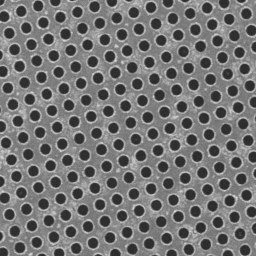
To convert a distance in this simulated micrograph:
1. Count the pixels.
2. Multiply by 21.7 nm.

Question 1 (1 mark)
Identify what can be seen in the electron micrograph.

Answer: a regular array of holes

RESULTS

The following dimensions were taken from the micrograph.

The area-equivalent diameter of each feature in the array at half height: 243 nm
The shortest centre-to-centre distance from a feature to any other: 373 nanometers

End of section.